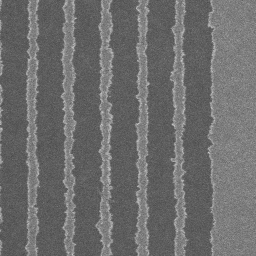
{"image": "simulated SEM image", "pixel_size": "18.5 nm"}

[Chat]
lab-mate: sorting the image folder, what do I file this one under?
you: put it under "parallel lines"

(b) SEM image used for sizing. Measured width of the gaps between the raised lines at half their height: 518 nm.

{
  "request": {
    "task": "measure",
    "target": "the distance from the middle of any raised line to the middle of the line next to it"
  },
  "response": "680 nm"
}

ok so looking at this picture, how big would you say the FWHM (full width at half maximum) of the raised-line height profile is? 160 nm